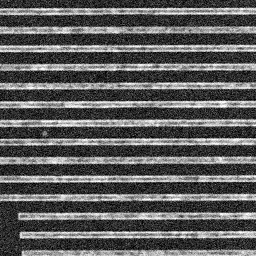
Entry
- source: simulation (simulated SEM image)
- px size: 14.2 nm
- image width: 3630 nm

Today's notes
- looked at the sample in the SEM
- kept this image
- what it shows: parallel lines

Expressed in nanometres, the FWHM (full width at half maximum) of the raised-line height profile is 67.3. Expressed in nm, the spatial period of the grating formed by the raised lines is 264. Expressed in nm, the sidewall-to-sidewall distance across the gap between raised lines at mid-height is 191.